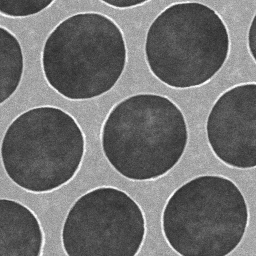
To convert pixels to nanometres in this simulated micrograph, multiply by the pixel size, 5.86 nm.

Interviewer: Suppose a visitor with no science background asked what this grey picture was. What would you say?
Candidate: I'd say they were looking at holes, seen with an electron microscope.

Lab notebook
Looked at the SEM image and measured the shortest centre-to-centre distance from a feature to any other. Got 589 nm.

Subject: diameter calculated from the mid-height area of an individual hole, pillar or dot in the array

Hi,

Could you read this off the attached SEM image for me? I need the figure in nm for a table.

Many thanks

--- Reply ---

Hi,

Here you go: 491